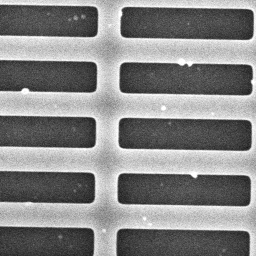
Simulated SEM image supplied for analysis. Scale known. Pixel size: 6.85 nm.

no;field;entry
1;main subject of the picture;groups of lines, slits or small figures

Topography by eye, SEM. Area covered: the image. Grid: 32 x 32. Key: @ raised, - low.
----@@@@@@@@@@@@@@@@@@@@@@@@@@@@
------------@@@-----------------
------------@@@-----------------
------------@@@-----------------
------------@@@-----------------
@@@@@@@@@@@@@@@@@@@@@@@@@@@@@@@@
@@@@@@@@@@@@@@@@@@@@@@@@@@@@@@@@
----@@@@@@@@@@@@@@@@@@@@@@@@@@@@
------------@@@-----------------
------------@@@-----------------
------------@@@-----------------
@@@@--------@@@----------------@
@@@@@@@@@@@@@@@@@@@@@@@@@@@@@@@@
@@@@@@@@@@@@@@@@@@@@@@@@@@@@@@@@
----------@@@@@@@@@@@@@@@@@@@@@@
------------@@@----------------@
------------@@@-----------------
------------@@@-----------------
@@@--------@@@@----------------@
@@@@@@@@@@@@@@@@@@@@@@@@@@@@@@@@
@@@@@@@@@@@@@@@@@@@@@@@@@@@@@@@@
----------@@@@@@@@@@@@@@@@@@@@@@
------------@@@----------------@
------------@@@----------------@
------------@@@----------------@
@@@@@@@@@--@@@@----------------@
@@@@@@@@@@@@@@@@@@@@@@@@@@@@@@@@
@@@@@@@@@@@@@@@@@@@@@@@@@@@@@@@@
-----------@@@@@@@@@@@@@@@@@@@@@
------------@@@----------------@
------------@@-----------------@
------------@@-----------------@